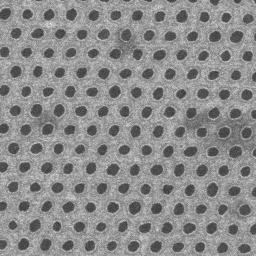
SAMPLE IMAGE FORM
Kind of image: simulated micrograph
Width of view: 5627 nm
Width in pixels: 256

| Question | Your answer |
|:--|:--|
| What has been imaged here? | a regular array of holes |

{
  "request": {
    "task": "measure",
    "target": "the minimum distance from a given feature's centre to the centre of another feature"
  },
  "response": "472 nanometres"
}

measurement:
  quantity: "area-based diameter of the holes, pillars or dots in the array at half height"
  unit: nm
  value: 260